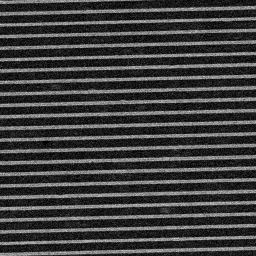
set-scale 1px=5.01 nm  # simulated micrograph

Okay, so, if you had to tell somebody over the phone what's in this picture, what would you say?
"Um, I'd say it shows parallel lines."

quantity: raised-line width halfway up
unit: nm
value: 15.7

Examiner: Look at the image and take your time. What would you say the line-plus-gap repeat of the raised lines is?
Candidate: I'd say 57.4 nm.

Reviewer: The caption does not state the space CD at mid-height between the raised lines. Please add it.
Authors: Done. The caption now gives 42.6 nanometres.